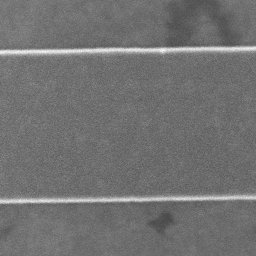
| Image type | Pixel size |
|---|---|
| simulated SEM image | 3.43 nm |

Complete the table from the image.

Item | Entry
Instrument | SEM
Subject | one or a few lines or trenches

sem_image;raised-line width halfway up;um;0.517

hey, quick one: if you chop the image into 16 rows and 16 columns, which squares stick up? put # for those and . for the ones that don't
................
................
................
################
################
################
################
################
################
################
################
################
#########.......
................
................
................